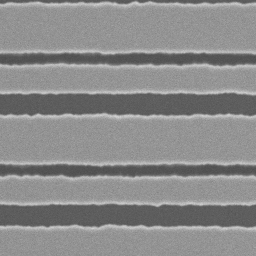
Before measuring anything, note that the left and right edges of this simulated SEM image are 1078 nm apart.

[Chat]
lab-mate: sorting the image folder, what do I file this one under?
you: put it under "lines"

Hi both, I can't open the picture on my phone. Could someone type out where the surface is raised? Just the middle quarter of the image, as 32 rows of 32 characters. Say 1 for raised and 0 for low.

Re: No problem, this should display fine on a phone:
11111111111101111111111011111111
11111111111111111111111111111111
11111111111111111111111111111111
11111111111111111111111111111111
11111111111111111111111111111111
11111111111111111111111111111111
11111111111111111111111111111111
00000000000000000000000000000000
00000000000000000000000000000000
00000000000000000000000000000000
00000000000000000000000000000000
00000000000000000000000000000000
00000000011000000000000000000000
11111111111111111111111111111111
11111111111111111111111111111111
11111111111111111111111111111111
11111111111111111111111111111111
11111111111111111111111111111111
11111111111111111111111111111111
11111111111111111111111111111111
11111111111111111111111111111111
11111111111111111111111111111111
11111111111111111111111111111111
11111111111111111111111111111111
11111111111111111111111111111111
00000000010000000000000000000000
00000000000000000000000000000000
00000000000000000000000000000000
11111111111111111111111111111111
11111111111111111111111111111111
11111111111111111111111111111111
11111111111111111111111111111111